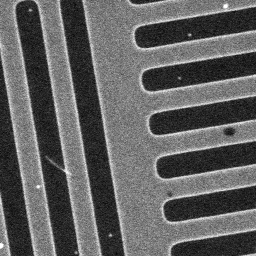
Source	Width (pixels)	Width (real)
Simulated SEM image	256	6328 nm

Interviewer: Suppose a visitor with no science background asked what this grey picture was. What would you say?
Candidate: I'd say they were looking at groups of lines, slits or small figures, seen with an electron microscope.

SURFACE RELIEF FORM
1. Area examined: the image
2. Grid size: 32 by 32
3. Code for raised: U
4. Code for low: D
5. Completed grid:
UUDDDUUDDDUUUUUUUDUUUUUUUUUUUUUU
UUDDDUUUDDDUUUUUUUUUUUUUUUUUDDDD
UUDDDUUUDDDUUUUUUUUUUUDDDDDDDDDD
UUDDDUUUDDDUUUUUUDDDDDDDDDDDDDDD
UUDDDUUUDDDUUUUUUDDDDDDDDDDDUUUU
UUUDDDUUDDDUUUUUUDDDDDUUUUUUUUUU
UUUDDDUUDDDUUUUUUUUUUUUUUUUUUUUD
UUUDDDUUUDDDUUUUUUUUUUUUUDDDDDDD
UUUDDDUUUDDDUUUUUUUDDDDDDDDDDDDD
DUUDDDUUUDDDUUUUUUDDDDDDDDDDDDDU
DUUDDDUUUDDDUUUUUUDDDDDDDUUUUUUU
DUUUDDDUUDDDUUUUUUUUUUUUUUUUUUUU
DUUUDDDUUDDDUUUUUUUUUUUUUUUUUDDD
DUUUDDDUUUDDDUUUUUUUUUUDDDDDDDDD
DUUUDDDUUUDDDUUUUUUDDDDDDDDDDDDD
DDUUDDDUUUDDDUUUUUUDDDDDDDDDDUUU
DDUUDDDUUUDDDUUUUUUDDDDUUUUUUUUU
DDUUUDDDUUDDDUUUUUUUUUUUUUUUUUUU
DDUUUDDDUUDDDUUUUUUUUUUUUUDDDDDD
DDUUUDDDUUUDDDUUUUUUDDDDDDDDDDDD
DDUUUDDDUUUDDDUUUUUUDDDDDDDDDDDD
DDDUUDDDUUUDDDUUUUUUDDDDDDUUUUUU
DDDUUDDDUUUDDDUUUUUUUUUUUUUUUUUU
DDDUUUDDDUUDDDUUUUUUUUUUUUUUUUDD
DDDUUUDDDUUDDDUUUUUUUUUUDDDDDDDD
DDDUUUDDDUUUDDDUUUUUUDDDDDDDDDDD
DDDUUUDDDUUUDDDUUUUUDDDDDDDDDDUU
UDDDUUDDDUUUDDDUUUUUUDDDUUUUUUUU
UDDDUUDDDUUUDDDUUUUUUUUUUUUUUUUU
UDDDUUUDDDUUDDDUUUUUUUUUUUUDDDDD
UDDDUUUDDDUUDDDUUUUUUUDDDDDDDDDD
UDDDUUUDDDUUUDDDUUUUUDDDDDDDDDDD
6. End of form